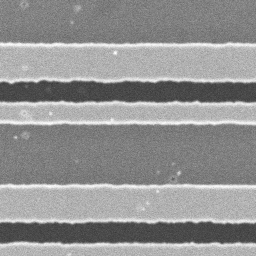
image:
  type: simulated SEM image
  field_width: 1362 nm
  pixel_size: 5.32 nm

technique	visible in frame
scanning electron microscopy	lines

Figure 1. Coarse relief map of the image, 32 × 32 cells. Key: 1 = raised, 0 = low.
00000000000000000000000000000000
00000000000000000000000000000000
00000000000000000000000000000000
00000000000000000000000000000000
00000000000000000000000000000000
11100001000000000010000011001100
11111111111111111111111111111111
11111111111111111111111111111111
11111111111111111111111111111111
11111111111111111111111111111111
00000000000000000000000000000000
00000000000000000000000000000000
00000000000000000000000000000000
11111111111111111111111111111111
11111111111111111111111111111111
00000000000000000000000000000000
00000000000000000000000000000000
00000000000000000000000000000000
00000000000000000000000000000000
00000000000000000000000000000000
00000000000000000000000000000000
00000000000000000000000000000000
00000000000000000000000000000000
11111111111111111111111111111111
11111111111111111111111111111111
11111111111111111111111111111111
11111111111111111111111111111111
11111111111111111111111111111111
00000000000000000000000000000000
00000000000000000000000000000000
01111111010011111111100111100111
11111111111111111111111111111111